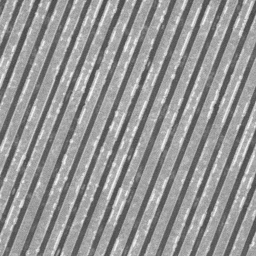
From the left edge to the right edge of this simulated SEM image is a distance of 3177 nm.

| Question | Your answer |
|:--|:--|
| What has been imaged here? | parallel lines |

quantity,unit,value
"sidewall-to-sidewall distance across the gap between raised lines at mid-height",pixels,5.71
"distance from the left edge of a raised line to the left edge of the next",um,0.196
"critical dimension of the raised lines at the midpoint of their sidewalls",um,0.123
